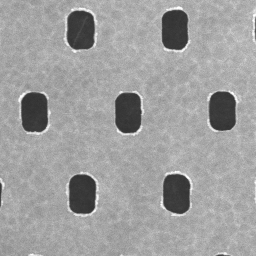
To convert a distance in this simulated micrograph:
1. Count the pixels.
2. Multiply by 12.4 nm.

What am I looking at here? holes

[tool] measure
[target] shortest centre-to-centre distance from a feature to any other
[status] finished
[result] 1170 nm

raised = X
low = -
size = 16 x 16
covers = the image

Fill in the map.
XXXXXXXXXXXXXXXX
XXXX--XXXX--XXXX
XXXX--XXXX--XXXX
XXXXXXXXXXXXXXXX
XXXXXXXXXXXXXXXX
XXXXXXXXXXXXXXXX
X--XXXX--XXXX--X
X--XXXX--XXXX--X
XXXXXXXXXXXXXXXX
XXXXXXXXXXXXXXXX
XXXXXXXXXXXXXXXX
XXXX--XXXX--XXXX
XXXX--XXXX--XXXX
XXXXXXXXXXXXXXXX
XXXXXXXXXXXXXXXX
XXXXXXXXXXXXXXXX